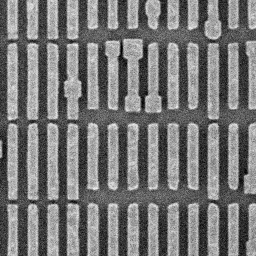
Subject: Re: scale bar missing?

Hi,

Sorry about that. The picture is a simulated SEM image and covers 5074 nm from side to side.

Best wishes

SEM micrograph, wiring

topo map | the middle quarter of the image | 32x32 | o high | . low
.oo...oo...oo...oo...oo...oo...o
.oo...oo...oo...oo...oo...oo...o
.oo...oo...oo...oo...oo...oo...o
.oo...oo...oo...oo...oo...oo...o
.ooo..oo...oo...oo...oo...oo...o
oooo..oo...oo...oo...oo...oo...o
oooo..oo...oo...oo...oo...oo...o
oooo..oo...oo...oo...oo...oo...o
.oo...oo...oo..oooo..ooo..oo...o
.oo...oo...oo..oooo..ooo..oo...o
.oo...oo...oo..oooo..ooo..oo...o
.oo.............ooo..ooo........
.oo.............................
.oo.............................
................................
.oo...oo....o...oo...oo...oo...o
.oo...oo...oo...oo...oo...oo...o
.oo...oo...oo...oo...oo...oo...o
.oo...oo...oo...oo...oo...oo...o
.oo...oo...oo...oo...oo...oo...o
.oo...oo...oo...oo...oo...oo...o
.oo...oo...oo...oo...oo...oo...o
.oo...oo...oo...oo...oo...oo...o
.oo...oo...oo...oo...oo...oo...o
.oo...oo...oo...oo...oo...oo...o
.oo...oo...oo...oo...oo...oo...o
.oo...oo...oo...oo...oo...oo...o
.oo...oo...oo...oo...oo...oo...o
.oo...oo...oo...oo...oo...oo...o
.oo...oo...oo...oo...oo...oo...o
.oo...oo...oo...oo...oo...oo...o
.oo.............................